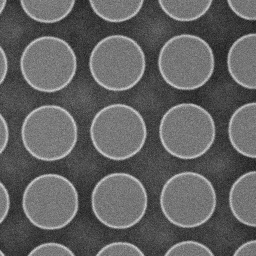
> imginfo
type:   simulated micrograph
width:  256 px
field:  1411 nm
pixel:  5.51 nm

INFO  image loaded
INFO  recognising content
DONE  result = an array of small figures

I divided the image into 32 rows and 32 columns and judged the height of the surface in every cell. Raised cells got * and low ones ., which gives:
*..******..*******..******...***
...******...*****....*****...***
.....**......***......**........
................................
......................**.......*
....****....*****....*****...***
...******...******..******...***
*..******..*******..*******.****
*..******..*******..*******..***
*..******...******..******...***
....****.....****....****.....**
................................
................................
.....**......***.....****.....**
....*****...******...*****...***
*..******..*******..*******..***
*..******..*******..*******..***
*..*******..******..*******..***
...******...******...*****...***
....****.....***......***......*
................................
................................
....****.....****....*****....**
*..******...******...******..***
*..*******..******..*******..***
*..*******..******..*******..***
*..*******..******..*******..***
....*****....****....*****....**
.....**.........................
................................
......*.......**......***......*
....*****...******...*****....**